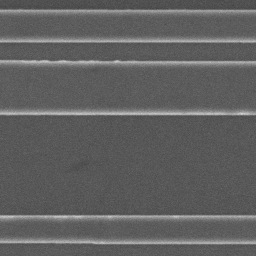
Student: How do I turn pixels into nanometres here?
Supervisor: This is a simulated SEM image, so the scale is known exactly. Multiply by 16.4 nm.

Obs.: lines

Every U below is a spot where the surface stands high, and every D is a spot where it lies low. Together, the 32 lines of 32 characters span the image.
DDDDDDDDDDDDDDDDDDDDDDDDDDDDDDDD
UUUUUUUUUUUUUUUUUUUUUUUUUUUUUUUU
UUUUUUUUUUUUUUUUUUUUUUUUUUUUUUUU
UUUUUUUUUUUUUUUUUUUUUUUUUUUUUUUU
UUUUUUUUUUUUUUUUUUUUUUUUUUUUUUUU
UUUUUUUUUUUUUUUUUUUUUUUUUUUUUUUU
UUUUUUUUUUUUUUUUUUUUUUUUUUUUUUUU
UUUUUUUUUUUUUUUUUUUUUUUUUUUUUUUU
UUUUUUUUUUUUUUUUUUUUUUUUUUUUUUUU
UUUUUUUUUUUUUUUUUUUUUUUUUUUUUUUU
UUUUUUUUUUUUUUUUUUUUUUUUUUUUUUUU
UUUUUUUUUUUUUUUUUUUUUUUUUUUUUUUU
UUUUUUUUUUUUUUUUUUUUUUUUUUUUUUUU
UUUUUUUUUUUUUUUUUUUUUUUUUUUUUUUU
DDDDDDDDDDDDDDDDDDDDDDDDDDDDDDDD
DDDDDDDDDDDDDDDDDDDDDDDDDDDDDDDD
DDDDDDDDDDDDDDDDDDDDDDDDDDDDDDDD
DDDDDDDDDDDDDDDDDDDDDDDDDDDDDDDD
DDDDDDDDDDDDDDDDDDDDDDDDDDDDDDDD
DDDDDDDDDDDDDDDDDDDDDDDDDDDDDDDD
DDDDDDDDDDDDDDDDDDDDDDDDDDDDDDDD
DDDDDDDDDDDDDDDDDDDDDDDDDDDDDDDD
DDDDDDDDDDDDDDDDDDDDDDDDDDDDDDDD
DDDDDDDDDDDDDDDDDDDDDDDDDDDDDDDD
DDDDDDDDDDDDDDDDDDDDDDDDDDDDDDDD
DDDDDDDDDDDDDDDDDDDDDDDDDDDDDDDD
DDDDDDDDDDDDDDDDDDDDDDDDDDDDDDDD
UUUUUUUUUUUUUUUUUUUUUUUUUUUUUUUU
UUUUUUUUUUUUUUUUUUUUUUUUUUUUUUUU
UUUUUUUUUUUUUUUUUUUUUUUUUUUUUUUU
UUUUUUUUUUUUUUUUUUUUUUUUUUUUUUUU
UUUUUUUUUUUUUUUUUUUUUUUUUUUUUUUU